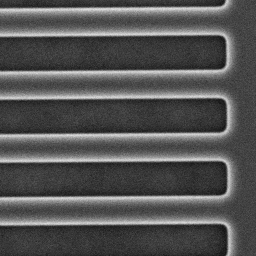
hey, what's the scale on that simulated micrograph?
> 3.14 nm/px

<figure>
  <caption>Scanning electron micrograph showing groups of lines, slits or small figures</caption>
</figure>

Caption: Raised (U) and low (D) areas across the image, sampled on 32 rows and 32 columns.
DDDDDDDDDDDDDDDDDDDDDDDDDDDDUUUU
UUUUUUUUUUUUUUUUUUUUUUUUUUUUUUUU
UUUUUUUUUUUUUUUUUUUUUUUUUUUUUUUU
UUUUUUUUUUUUUUUUUUUUUUUUUUUUUUUU
DDDDDDDDDDDDDDDDDDDDDDDDDDDDUUUU
DDDDDDDDDDDDDDDDDDDDDDDDDDDDUUUU
DDDDDDDDDDDDDDDDDDDDDDDDDDDDUUUU
DDDDDDDDDDDDDDDDDDDDDDDDDDDDUUUU
DDDDDDDDDDDDDDDDDDDDDDDDDDDDUUUU
UUUUUUUUUUUUUUUUUUUUUUUUUUUUUUUU
UUUUUUUUUUUUUUUUUUUUUUUUUUUUUUUU
UUUUUUUUUUUUUUUUUUUUUUUUUUUUUUUU
DDDDDDDDDDDDDDDDDDDDDDDDDDDDUUUU
DDDDDDDDDDDDDDDDDDDDDDDDDDDDUUUU
DDDDDDDDDDDDDDDDDDDDDDDDDDDDDUUU
DDDDDDDDDDDDDDDDDDDDDDDDDDDDUUUU
DDDDDDDDDDDDDDDDDDDDDDDDDDDDUUUU
UUUUUUUUUUUUUUUUUUUUUUUUUUUUUUUU
UUUUUUUUUUUUUUUUUUUUUUUUUUUUUUUU
UUUUUUUUUUUUUUUUUUUUUUUUUUUUUUUU
DDDDDDDDDDDDDDDDDDDDDDDDDDDDUUUU
DDDDDDDDDDDDDDDDDDDDDDDDDDDDDUUU
DDDDDDDDDDDDDDDDDDDDDDDDDDDDDUUU
DDDDDDDDDDDDDDDDDDDDDDDDDDDDUUUU
DDDDDDDDDDDDDDDDDDDDDDDDDDDDUUUU
UUUUUUUUUUUUUUUUUUUUUUUUUUUUUUUU
UUUUUUUUUUUUUUUUUUUUUUUUUUUUUUUU
UUUUUUUUUUUUUUUUUUUUUUUUUUUUUUUU
DDDDDDDDDDDDDDDDDDDDDDDDDDDDUUUU
DDDDDDDDDDDDDDDDDDDDDDDDDDDDDUUU
DDDDDDDDDDDDDDDDDDDDDDDDDDDDDUUU
DDDDDDDDDDDDDDDDDDDDDDDDDDDDDUUU